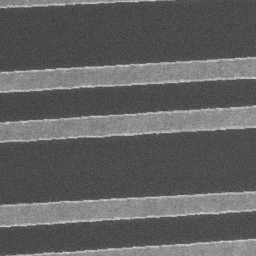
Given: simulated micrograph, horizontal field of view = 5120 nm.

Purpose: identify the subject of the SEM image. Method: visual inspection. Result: lines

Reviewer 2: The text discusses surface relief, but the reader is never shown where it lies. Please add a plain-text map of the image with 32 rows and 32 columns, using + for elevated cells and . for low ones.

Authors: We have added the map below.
++++++++++......................
................................
................................
................................
................................
................................
................................
............................++++
...........+++++++++++++++++++++
++++++++++++++++++++++++++++++++
++++++++++++++++++..............
+...............................
................................
.............................+++
..............++++++++++++++++++
++++++++++++++++++++++++++++++++
+++++++++++++++++++++...........
+++++...........................
................................
................................
................................
................................
................................
................................
......................++++++++++
.....+++++++++++++++++++++++++++
++++++++++++++++++++++++++++....
+++++++++++++...................
................................
................................
........................++++++++
.........+++++++++++++++++++++++